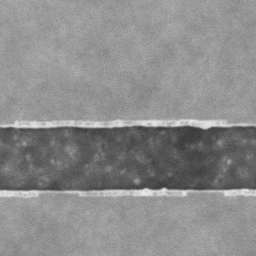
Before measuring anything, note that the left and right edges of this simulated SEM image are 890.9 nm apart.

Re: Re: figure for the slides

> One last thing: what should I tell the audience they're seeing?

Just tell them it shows one or a few lines or trenches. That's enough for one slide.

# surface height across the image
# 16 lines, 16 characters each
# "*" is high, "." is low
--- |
****************
****************
****************
****************
****************
****************
****************
****************
................
................
................
................
****************
****************
****************
****************